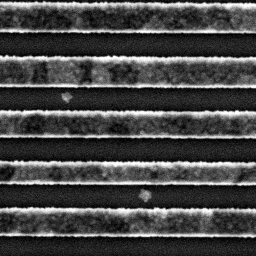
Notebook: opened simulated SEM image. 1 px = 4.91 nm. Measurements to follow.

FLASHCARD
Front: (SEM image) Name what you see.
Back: lines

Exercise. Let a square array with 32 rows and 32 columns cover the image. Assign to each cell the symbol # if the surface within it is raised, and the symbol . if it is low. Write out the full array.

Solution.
##########..##...#....##........
################################
################################
################################
................................
................................
................................
################################
################################
################################
################################
................................
................................
................................
################################
################################
################################
................................
................................
................................
################################
################################
################################
................................
................................
................................
################################
################################
################################
.#..##.#########################
................................
................................